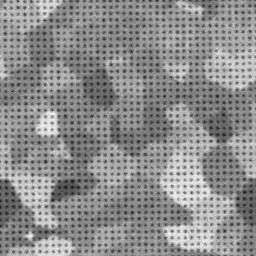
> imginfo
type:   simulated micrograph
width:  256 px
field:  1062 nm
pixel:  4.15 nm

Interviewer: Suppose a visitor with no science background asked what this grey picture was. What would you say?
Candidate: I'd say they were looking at a regular array of holes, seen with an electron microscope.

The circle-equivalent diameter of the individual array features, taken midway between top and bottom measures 11.5 nm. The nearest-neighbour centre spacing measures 25.6 nanometers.